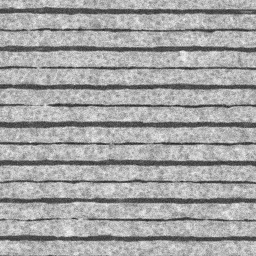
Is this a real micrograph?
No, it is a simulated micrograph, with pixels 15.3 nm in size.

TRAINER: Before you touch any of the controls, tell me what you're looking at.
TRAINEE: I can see parallel lines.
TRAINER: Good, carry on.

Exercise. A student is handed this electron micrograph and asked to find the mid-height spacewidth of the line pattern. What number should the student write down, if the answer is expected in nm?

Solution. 82.3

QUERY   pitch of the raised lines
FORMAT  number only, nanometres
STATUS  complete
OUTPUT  287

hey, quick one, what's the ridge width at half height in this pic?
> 14.5 px